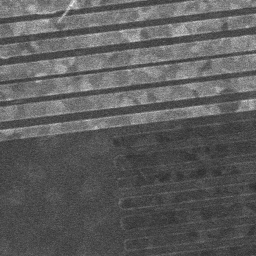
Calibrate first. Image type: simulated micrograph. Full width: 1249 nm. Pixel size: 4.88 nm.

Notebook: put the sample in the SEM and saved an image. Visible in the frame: parallel lines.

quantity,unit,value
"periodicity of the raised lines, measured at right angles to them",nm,101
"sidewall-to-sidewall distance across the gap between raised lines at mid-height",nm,38.1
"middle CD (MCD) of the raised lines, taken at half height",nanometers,64.8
